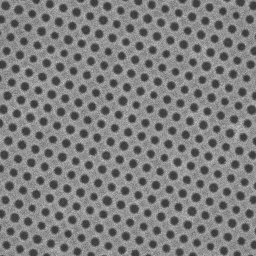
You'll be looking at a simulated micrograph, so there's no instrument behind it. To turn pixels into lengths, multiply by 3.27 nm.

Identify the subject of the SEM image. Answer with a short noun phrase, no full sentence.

a regular array of holes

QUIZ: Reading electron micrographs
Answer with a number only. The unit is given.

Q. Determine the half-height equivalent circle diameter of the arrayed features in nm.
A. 27.8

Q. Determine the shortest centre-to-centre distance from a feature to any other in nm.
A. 45.3